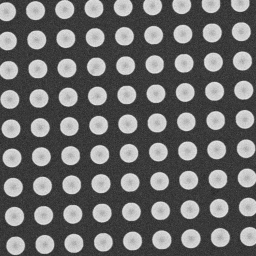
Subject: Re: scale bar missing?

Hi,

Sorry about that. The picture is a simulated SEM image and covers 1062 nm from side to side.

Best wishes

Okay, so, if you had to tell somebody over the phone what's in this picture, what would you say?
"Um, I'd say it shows an array of small figures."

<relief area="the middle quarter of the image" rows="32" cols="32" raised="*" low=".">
***...****...*****...****...****
***...****...****....***.....***
***....**.....**................
................................
................................
......................**.....***
**.....***....****...****...****
***...*****..*****...****...****
***...*****...****...****...****
***....***....***.....**........
................................
................................
.......................*......**
.*.....***....****...****....***
***....****...****...*****..****
***....****...****...****....***
***....****...****....***.....*.
***.....*.......................
................................
................................
........**.....***....***....***
***....****...****...*****...***
****...****...****...*****...***
****...****...****....***....***
***.....**......*...............
................................
................................
................*......**.....**
***....****....****...****...***
****...****...*****...****...***
****...****...*****...****...***
****....***....***..............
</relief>